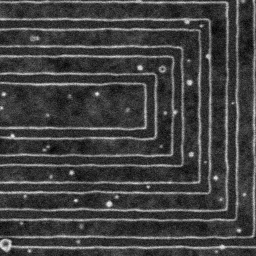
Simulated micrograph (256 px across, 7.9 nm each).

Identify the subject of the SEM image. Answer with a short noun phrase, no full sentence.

groups of lines, slits or small figures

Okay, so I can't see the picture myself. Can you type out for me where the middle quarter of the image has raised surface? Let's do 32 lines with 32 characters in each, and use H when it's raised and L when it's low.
HHHHHHHHHHHHHHHHHHHHHHHHHHHLLLHH
HHHHHHHHHHHHHHHHHHHHHHHHLHHLLLHH
LLLLLLLLLLLLHHHLLLLLLLHHHHHLLLHH
LLLLLLLLLLLLLLLLLLLLLLLHHHHLLLHH
LLLLLLLLLLLLLLLLLLLLLLLHHHHLLLHH
HHHHHHHHHHHHHHHHHHHHLLLHHHHLLLHH
HHHHHHHHHHHHHHHHHHHHLLLHHHHLLLHH
HHHHHHHHHHHHHHHHHHHHLLLHHHHLLLHH
HHHHHHHHHHHHHHHHHHHHLLLHHHHLLLHH
HHHHHHHHHHHHHHHHHHHHLLLHHHHLLLHH
HHHHHHHHHHHHHHHHHHHHLLLHHHHLLLHH
HHHHHHHHHHHHHHHHHHHHLLLHHHHLLLHH
HHHHHHHHHHHHHHHHHHHHLLLHHHHLLLHH
HHHHHHHHHHHHHHHHHHHHLLLHHHHLLLHH
HHHHHHHHHHHHHHHHHHHHLLLHHHHLLLHH
HHHHHHHHHHHHHHHHHHHHLLLHHHHLLLHH
LLLLLLLLLLLLLLLLLLLLLLLHHHHLLLHH
LLLLLLLLLLLLLLLLLLLLLLLHHHHLLLHH
LLLLLLHLLLLLLLHHHLLLLLLHHHHLLLHH
HHHHHHHHHHHHHHHHHHHHHHHHHHHLLLHH
HHHHHHHHHHHHHHHHHHHHHHHHHHHLLLHH
HHHHHHHHHHHHHHHHHHHHHHHHHHHLLLHH
HHHHHHHHHHHHHHHHHHHHHHHHHHHLLLHH
LLLLLLLLLLLLLLLLLLLLLLLLLLLLLLHH
LLLLLLLLLLLLLLLLLLLLLLLLLLLLLLHH
HHLHHHHHHHHHHHHHHHHLLHHHHHHLLHHH
HHHHHHHHHHHHHHHHHHHHHHHHHHHHHHHH
HHHHHHHHHHHHHHHHHHHHHHHHHHHHHHHH
HHHHHHHHHHHHHHHHHHHHHHHHHHHHHHHH
HHHHHHHHHHLHHHHHHHHHHHHHHHHHHHHH
LLLLLLLLLLLLLLLLLLLLLLLLLLLLLLLL
LLLLLLLLLLLLLLLLLLLLLLLLLLLLLLLL